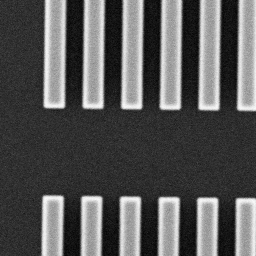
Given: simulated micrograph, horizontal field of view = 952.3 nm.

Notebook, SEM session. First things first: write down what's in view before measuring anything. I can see groups of lines, slits or small figures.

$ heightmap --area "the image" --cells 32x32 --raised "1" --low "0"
00000011000110011100111001100011
00000011000110011100111001100011
00000011000110011100111001100011
00000011000110011100111001100011
00000011000110011100111001100011
00000011000110011100111001100011
00000011000110011100111001100011
00000011000110011100110001100011
00000011000110011100110001100011
00000011000110011100110001100011
00000011000110011100110001100011
00000011000110011100110001100011
00000011000110011100110001100011
00000000000000001000110001100011
00000000000000000000000000000000
00000000000000000000000000000000
00000000000000000000000000000000
00000000000000000000000000000000
00000000000000000000000000000000
00000000000000000000000000000000
00000000000000000000000000000000
00000000000000000000000000000000
00000000000000000000000000000000
00000000000000000000000000000000
00000000000000000000000000000000
00000111001110011100110001100011
00000111001110011100110001100011
00000111001110011000110001100011
00000111001110011000110001100011
00000111001110011000110001100011
00000111001110011000110001100011
00000111001110011000110001100011